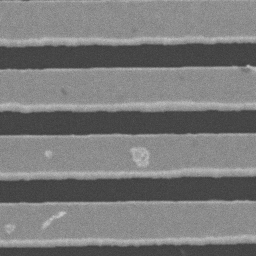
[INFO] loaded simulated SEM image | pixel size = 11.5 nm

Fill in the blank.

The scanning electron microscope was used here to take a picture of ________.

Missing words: lines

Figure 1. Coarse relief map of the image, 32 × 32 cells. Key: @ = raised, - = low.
@@@@@@@@@@@@@@@@@@@@@@@@@@@@@@@@
@@@@@@@@@@@@@@@@@@@@@@@@@@@@@@@@
@@@@@@@@@@@@@@@@@@@@@@@@@@@@@@@@
@@@@@@@@@@@@@@@@@@@@@@@@@@@@@@@@
@@@@@@@@@@@@@@@@@@@@@@@@@@@@@@@@
--------------------------------
--------------------------------
--------------------------------
-----------------------@@@@@@@@@
@@@@@@@@@@@@@@@@@@@@@@@@@@@@@@@@
@@@@@@@@@@@@@@@@@@@@@@@@@@@@@@@@
@@@@@@@@@@@@@@@@@@@@@@@@@@@@@@@@
@@@@@@@@@@@@@@@@@@@@@@@@@@@@@@@@
@@@@@@@@@@@@@@@@-@@@------------
--------------------------------
--------------------------------
--------------------------------
@@@@@@@@@@@@@@@@@@@@@@@@@@@@@@@@
@@@@@@@@@@@@@@@@@@@@@@@@@@@@@@@@
@@@@@@@@@@@@@@@@@@@@@@@@@@@@@@@@
@@@@@@@@@@@@@@@@@@@@@@@@@@@@@@@@
@@@@@@@@@@@@@@@@@@@@@@@@@@@@@@@@
--------------------------------
--------------------------------
--------------------------------
@@@@@@@@@@@@@@@@@@@@@@@@@@@@@@@@
@@@@@@@@@@@@@@@@@@@@@@@@@@@@@@@@
@@@@@@@@@@@@@@@@@@@@@@@@@@@@@@@@
@@@@@@@@@@@@@@@@@@@@@@@@@@@@@@@@
@@@@@@@@@@@@@@@@@@@@@@@@@@@@@@@@
@@@@@@@-------------------------
--------------------------------